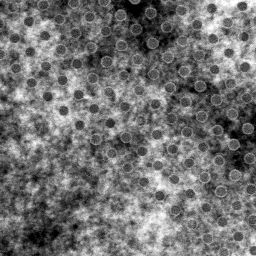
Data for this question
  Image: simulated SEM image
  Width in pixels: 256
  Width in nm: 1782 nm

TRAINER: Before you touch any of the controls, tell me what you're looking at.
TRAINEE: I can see a regular array of raised bodies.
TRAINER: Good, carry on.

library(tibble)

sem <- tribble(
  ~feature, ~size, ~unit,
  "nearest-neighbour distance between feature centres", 21.3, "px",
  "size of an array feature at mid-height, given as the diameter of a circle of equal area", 11.1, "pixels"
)